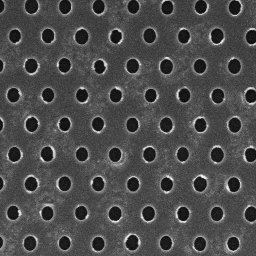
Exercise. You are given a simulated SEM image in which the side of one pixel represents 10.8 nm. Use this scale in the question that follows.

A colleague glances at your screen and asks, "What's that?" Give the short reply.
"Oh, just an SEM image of a regular array of holes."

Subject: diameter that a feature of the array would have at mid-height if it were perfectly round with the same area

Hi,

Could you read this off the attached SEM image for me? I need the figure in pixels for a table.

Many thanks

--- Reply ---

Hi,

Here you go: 13.3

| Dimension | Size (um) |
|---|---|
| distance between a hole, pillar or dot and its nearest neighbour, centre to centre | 0.36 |